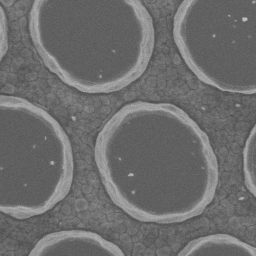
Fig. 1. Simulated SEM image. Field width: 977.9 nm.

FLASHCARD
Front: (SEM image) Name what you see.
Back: raised bodies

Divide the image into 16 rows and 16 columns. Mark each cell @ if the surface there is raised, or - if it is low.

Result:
--@@@@@@@---@@@@
--@@@@@@@--@@@@@
--@@@@@@@--@@@@@
---@@@@@@---@@@@
----@@@@@---@@@@
-----@@-------@@
@---------------
@@@----@@@@@----
@@@@--@@@@@@@---
@@@@--@@@@@@@--@
@@@@--@@@@@@@--@
@@@@---@@@@@@---
@@@----@@@@@@---
---------@@-----
----------------
--@@@@@-----@@@@